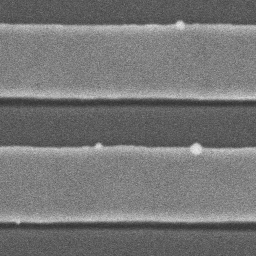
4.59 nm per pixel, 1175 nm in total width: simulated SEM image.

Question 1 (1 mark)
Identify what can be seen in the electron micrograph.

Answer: lines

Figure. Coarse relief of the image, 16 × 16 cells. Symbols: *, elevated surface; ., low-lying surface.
................
...........*....
****************
****************
****************
****************
................
................
................
****************
****************
****************
****************
****************
................
................